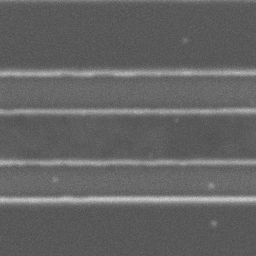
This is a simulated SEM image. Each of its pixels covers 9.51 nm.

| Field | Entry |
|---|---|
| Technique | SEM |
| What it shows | lines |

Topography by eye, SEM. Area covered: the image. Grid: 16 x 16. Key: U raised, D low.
UUUUUUUUUUUUUUUU
UUUUUUUUUUUUUUUU
UUUUUUUUUUUUUUUU
UUUUUUUUUUUUUUUU
UUUUUUUUUUUUUUUU
DDDDDDDDDDDDDDDD
DDDDDDDDDDDDDDDD
UUUUUUUUUUUUUUUU
UUUUUUUUUUUUUUUU
UUUUUUUUUUUUUUUU
DDDDDDDDDDDDDDDD
DDDDDDDDDDDDDDDD
UUUUUUUUUUUUUUUU
UUUUUUUUUUUUUUUU
UUUUUUUUUUUUUUUU
UUUUUUUUUUUUUUUU